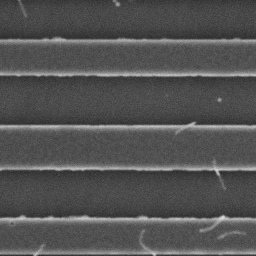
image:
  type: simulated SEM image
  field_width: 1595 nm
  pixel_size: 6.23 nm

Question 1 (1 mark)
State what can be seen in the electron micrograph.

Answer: lines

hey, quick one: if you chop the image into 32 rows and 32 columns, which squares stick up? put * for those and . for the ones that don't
................................
................................
................................
................................
................................
********************************
********************************
********************************
********************************
................................
................................
................................
................................
................................
................................
................................
********************************
********************************
********************************
********************************
********************************
................................
................................
................................
................................
................................
................................
********************************
********************************
********************************
********************************
********************************